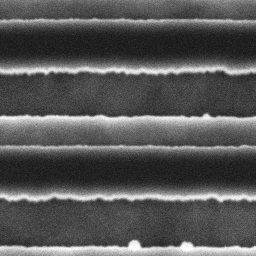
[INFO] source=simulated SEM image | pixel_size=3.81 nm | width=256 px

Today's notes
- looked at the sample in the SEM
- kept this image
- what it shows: lines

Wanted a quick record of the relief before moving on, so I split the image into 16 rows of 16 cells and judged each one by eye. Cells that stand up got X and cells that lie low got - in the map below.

XXXXXXXXXXXXXXXX
XXXXXXXXXXXXXXXX
XXXXXXXXXXXXXXXX
XXXXXXXXXXXXXXXX
--------------X-
----------------
----------------
XXXXXXXXXXXXXXXX
XXXXXXXXXXXXXXXX
XXXXXXXXXXXXXXXX
XXXXXXXXXXXXXXXX
XXXXXXXXXXXXXXXX
----------------
----------------
----------------
XXXXXXXXXXXXX-X-